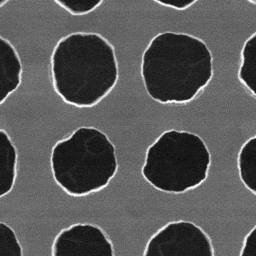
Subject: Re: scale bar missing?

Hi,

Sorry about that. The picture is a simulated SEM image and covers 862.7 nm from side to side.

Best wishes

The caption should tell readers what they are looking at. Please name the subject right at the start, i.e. holes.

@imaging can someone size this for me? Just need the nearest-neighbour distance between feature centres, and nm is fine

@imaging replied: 311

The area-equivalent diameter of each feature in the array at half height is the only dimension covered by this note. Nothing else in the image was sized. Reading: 65.4 pixels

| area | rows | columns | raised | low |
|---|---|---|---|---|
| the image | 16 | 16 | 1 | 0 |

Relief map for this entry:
1111001111111111
1111111111111111
1111001111001111
0110000110000110
0110000110000110
0111000110000111
1111101111111111
1111111111111111
1111000111001111
0110000110000110
0110000110000110
0111001111001110
1111111111111111
1111111111111111
0111001111000111
0110000110000110